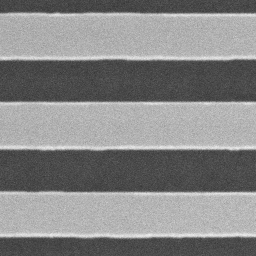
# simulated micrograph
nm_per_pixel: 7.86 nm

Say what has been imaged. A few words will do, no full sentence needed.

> lines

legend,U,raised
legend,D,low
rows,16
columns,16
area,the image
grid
DDDDDDDDDDDDDDDD
UUUUUUUUUUUUUUUU
UUUUUUUUUUUUUUUU
UUUUUUUUUUUUUUUU
DDDDDDDDDDDDDDDD
DDDDDDDDDDDDDDDD
UUUUUUUUUUUUUUUU
UUUUUUUUUUUUUUUU
UUUUUUUUUUUUUUUU
DDDDDDDDDDDDDDDD
DDDDDDDDDDDDDDDD
DDDDDDDDDDDDDDDD
UUUUUUUUUUUUUUUU
UUUUUUUUUUUUUUUU
UUUUUUUUUUUUUUUU
DDDDDDDDDDDDDDDD